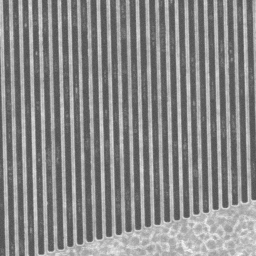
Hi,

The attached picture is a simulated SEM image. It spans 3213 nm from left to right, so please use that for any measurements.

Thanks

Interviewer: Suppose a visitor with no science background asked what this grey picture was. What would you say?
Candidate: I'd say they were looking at parallel lines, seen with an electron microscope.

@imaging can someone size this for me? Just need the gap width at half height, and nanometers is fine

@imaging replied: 91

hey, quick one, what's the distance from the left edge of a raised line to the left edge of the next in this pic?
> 122 nanometers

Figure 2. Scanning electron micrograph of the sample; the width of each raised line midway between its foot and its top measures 34.5 nm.